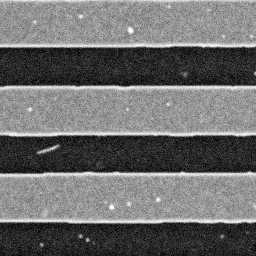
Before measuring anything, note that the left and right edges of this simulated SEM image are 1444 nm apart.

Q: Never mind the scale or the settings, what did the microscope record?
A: lines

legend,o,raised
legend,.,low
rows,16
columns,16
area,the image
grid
oooooooooooooooo
oooooooooooooooo
oooooooooooooooo
................
................
oooooooooooooooo
oooooooooooooooo
oooooooooooooooo
................
................
................
oooooooooooooooo
oooooooooooooooo
oooooooooooooooo
................
................